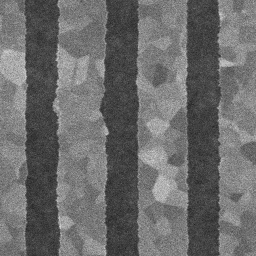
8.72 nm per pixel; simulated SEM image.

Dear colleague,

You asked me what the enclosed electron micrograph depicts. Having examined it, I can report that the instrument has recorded one or a few lines or trenches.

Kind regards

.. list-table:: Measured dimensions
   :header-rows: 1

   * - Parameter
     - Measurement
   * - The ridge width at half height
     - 417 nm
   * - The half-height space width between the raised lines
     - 286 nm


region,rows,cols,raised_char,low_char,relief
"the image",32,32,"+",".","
+++....++++++....++++++....+++++
+++.....+++.+....++++++....+++++
+++....++++++....++++++.....++++
+++....++++++....++++++.....++++
+++....++++++....++++++....+++++
+++....++++++....++++++....+++++
+++....++++++....++++++....+++++
+++....++++++....++++++....+++++
+++....++++++....++++++....+++++
+++....++++++....++++++....+++++
+++....++++++....++++++....+++++
+++....++++++....++++++.....++++
+++....++++++....++++++.....++++
+++....+++++.....++++++....+++++
+++....++++++....++++++....+++++
+++....++++++....++++++....+++++
+++....++++++....++++++....+++++
+++....++++++....++++++....+++++
+++....++++++....++++++....+++++
+++....++++++....++++++.....++++
+++....++++++....++++++....+++++
+++....++++++....++++++....+++++
+++....++++++....++++++.....++++
+++....++++++....++++++....+++.+
+++....++++++....++++++....+++++
+++....++++++....++++++....+++++
+++....++++++....++++++....+++++
+++....++++++....++++++....+++++
+++....++++++....++++++....+++++
+++.....+++++....++++++....+++++
+++.....+++++....+++++++...+++++
+++....++++++....++++++....+++++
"